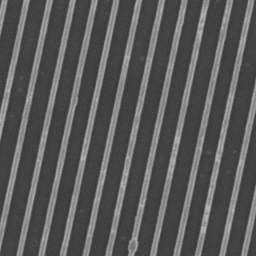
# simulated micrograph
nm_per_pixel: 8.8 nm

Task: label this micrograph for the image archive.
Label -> parallel lines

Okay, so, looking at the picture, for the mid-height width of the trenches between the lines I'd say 0.15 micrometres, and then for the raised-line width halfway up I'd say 0.0463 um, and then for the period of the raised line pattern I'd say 194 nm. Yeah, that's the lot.